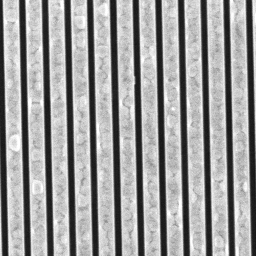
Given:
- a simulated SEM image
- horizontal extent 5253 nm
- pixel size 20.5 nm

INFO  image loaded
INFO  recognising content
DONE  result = parallel lines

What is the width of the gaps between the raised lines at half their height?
138 nm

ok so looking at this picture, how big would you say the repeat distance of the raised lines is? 22.7 pixels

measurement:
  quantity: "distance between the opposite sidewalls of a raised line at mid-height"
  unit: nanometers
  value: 328